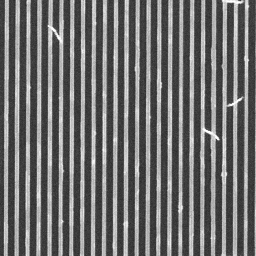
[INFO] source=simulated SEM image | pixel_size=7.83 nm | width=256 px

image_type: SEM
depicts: parallel lines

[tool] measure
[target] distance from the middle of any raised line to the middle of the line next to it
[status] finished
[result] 85.4 nm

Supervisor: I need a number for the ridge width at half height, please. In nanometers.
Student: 30.3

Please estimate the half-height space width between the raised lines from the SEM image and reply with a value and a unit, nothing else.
60.7 nm